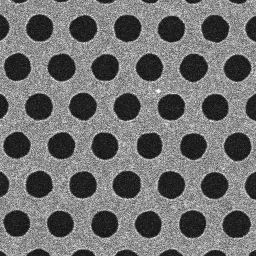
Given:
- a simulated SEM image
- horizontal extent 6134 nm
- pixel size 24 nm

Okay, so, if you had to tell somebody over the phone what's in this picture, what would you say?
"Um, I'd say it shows a regular array of holes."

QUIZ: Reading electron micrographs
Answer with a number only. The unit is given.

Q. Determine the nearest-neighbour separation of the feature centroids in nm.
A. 1050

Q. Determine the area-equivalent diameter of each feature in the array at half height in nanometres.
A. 664